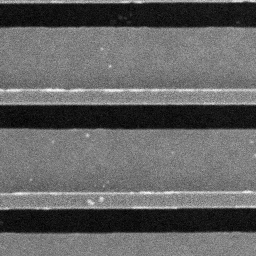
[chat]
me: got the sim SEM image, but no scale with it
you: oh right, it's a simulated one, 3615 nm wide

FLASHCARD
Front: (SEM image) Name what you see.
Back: lines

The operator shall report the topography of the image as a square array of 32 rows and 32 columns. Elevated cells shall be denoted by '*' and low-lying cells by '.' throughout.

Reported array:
................................
................................
................................
.*****.************.......****..
********************************
********************************
********************************
********************************
********************************
********************************
********************************
********************************
********************************
................................
................................
................................
********************************
********************************
********************************
********************************
********************************
********************************
********************************
********************************
********************************
********************************
................................
................................
................................
********************************
********************************
********************************